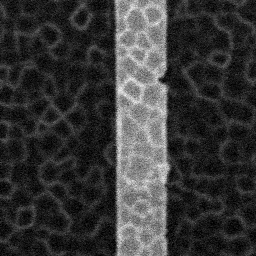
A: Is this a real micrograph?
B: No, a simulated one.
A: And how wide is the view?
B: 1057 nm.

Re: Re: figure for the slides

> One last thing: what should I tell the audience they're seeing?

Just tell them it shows one or a few lines or trenches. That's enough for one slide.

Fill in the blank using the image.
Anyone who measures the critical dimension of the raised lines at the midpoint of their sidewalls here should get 200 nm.